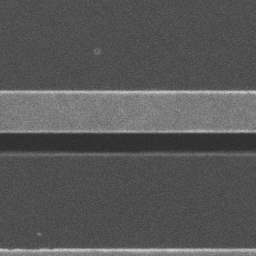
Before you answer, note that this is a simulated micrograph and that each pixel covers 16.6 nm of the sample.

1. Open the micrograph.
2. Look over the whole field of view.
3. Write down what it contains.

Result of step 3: lines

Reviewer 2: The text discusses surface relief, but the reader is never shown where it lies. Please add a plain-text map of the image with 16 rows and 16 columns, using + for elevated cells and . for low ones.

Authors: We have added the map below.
++++++++++++++++
++++++++++++++++
++++++++++++++++
++++++++++++++++
++++++++++++++++
++++++++++++++++
++++++++++++++++
++++++++++++++++
................
................
++++++++++++++++
++++++++++++++++
++++++++++++++++
++++++++++++++++
++++++++++++++++
++++++++++++++++